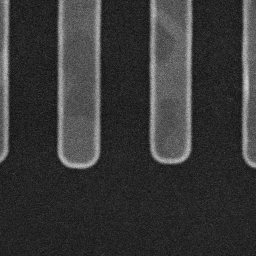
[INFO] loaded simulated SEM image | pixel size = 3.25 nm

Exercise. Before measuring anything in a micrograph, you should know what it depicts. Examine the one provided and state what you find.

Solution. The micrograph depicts one or a few lines or trenches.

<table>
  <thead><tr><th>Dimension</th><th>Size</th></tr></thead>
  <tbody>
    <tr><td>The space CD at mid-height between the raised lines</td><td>173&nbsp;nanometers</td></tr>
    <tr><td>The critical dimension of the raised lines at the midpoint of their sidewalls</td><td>0.126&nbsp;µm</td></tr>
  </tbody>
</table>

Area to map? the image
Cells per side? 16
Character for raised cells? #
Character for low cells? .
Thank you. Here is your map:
....##....##...#
....##....##...#
....##....##...#
....##....##...#
....##....##...#
....##....##...#
....##....##...#
....##...###...#
....##...###...#
....##....##...#
................
................
................
................
................
................